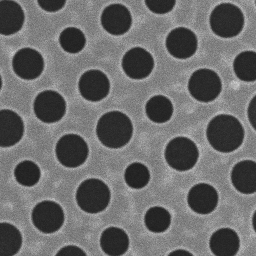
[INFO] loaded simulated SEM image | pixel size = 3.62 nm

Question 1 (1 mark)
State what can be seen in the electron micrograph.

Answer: a regular array of holes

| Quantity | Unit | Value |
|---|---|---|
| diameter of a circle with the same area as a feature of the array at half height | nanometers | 115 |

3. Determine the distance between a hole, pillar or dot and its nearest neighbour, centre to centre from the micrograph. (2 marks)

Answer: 174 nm